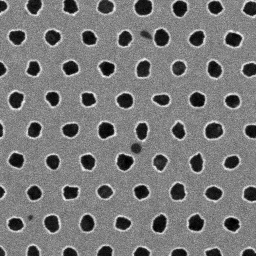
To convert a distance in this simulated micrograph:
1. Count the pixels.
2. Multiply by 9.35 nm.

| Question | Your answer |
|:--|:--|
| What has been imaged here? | a regular array of holes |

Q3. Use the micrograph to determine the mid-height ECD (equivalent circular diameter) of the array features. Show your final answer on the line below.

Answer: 0.144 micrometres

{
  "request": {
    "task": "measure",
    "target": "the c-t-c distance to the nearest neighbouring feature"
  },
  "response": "327 nm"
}